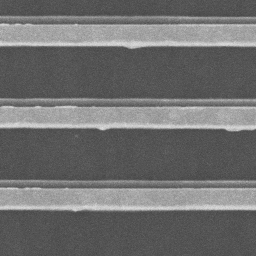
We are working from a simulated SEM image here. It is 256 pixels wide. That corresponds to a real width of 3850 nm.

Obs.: lines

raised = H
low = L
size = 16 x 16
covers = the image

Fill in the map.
LLLLLLLLLLLLLLLL
HHHHHHHHHHHHHHHH
HHHHHHHHHHHHHHHH
LLLLLLLLLLLLLLLL
LLLLLLLLLLLLLLLL
LLLLLLLLLLLLLLLL
HHHHHHHHHHHHHHHH
HHHHHHHHHHHHHHHH
LLLLLLLLLLLLLLLL
LLLLLLLLLLLLLLLL
LLLLLLLLLLLLLLLL
HHHHHHHHHHHHHHHH
HHHHHHHHHHHHHHHH
LLLLLLLLLLLLLLLL
LLLLLLLLLLLLLLLL
LLLLLLLLLLLLLLLL